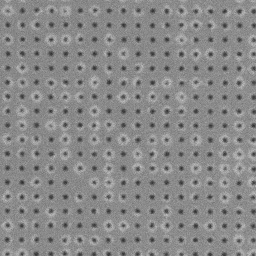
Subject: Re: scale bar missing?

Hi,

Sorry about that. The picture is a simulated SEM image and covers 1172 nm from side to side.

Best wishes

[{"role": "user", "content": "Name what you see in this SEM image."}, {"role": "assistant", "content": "a regular array of holes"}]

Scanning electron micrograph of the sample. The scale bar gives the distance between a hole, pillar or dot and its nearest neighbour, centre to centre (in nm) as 64.4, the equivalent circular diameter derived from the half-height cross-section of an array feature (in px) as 5.41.